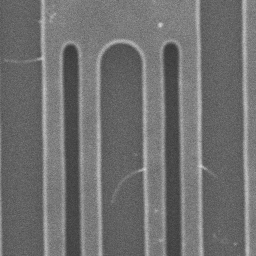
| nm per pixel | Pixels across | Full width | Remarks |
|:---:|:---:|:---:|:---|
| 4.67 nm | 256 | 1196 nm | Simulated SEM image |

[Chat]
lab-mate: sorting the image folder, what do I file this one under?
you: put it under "groups of lines, slits or small figures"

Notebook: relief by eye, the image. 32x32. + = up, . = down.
.....++++++++++++++++++++.....++
.....++++++++++++++++++++.....++
.....++++++++++++++++++++.....++
.....++++++++++++++++++++.....++
.....++++++++++++++++++++.....++
.....+++++++++..+++++.+++.....++
.....+++..+++....+++..+++.....++
.....+++..+++.....++..+++......+
.....+++..++......++..+++......+
......++..++......++..+++......+
......++..++......++..+++......+
......++..++......++..+++......+
......++..++......++..+++......+
......++..++......++..+++......+
......++..++......++..+++......+
......++..++......++..+++......+
......++..++......++...++......+
......++..++......++...++......+
......++..++......++...++......+
......++..++......++...++......+
......++..++......+++..++......+
......++..++......+++..++......+
......++..++......+++..++......+
......++..++......+++..++......+
......++..++......+++..++......+
......++..+++.....+++..++......+
......++..+++.....+++..++......+
......++..+++.....+++..++......+
......++..+++.....+++..++......+
......++..+++.....+++..++......+
......++..+++.....+++..++......+
......++..+++.....+++..++......+